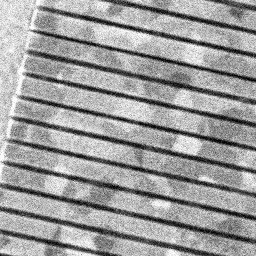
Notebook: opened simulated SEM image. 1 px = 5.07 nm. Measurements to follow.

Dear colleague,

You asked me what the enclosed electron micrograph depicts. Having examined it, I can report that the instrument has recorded parallel lines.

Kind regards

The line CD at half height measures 83.4 nm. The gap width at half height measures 0.0309 micrometres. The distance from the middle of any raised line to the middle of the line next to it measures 115 nm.